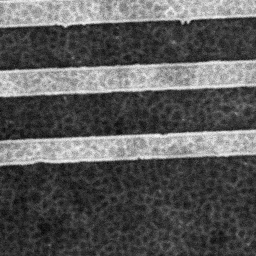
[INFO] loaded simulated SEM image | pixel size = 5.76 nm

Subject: one or a few lines or trenches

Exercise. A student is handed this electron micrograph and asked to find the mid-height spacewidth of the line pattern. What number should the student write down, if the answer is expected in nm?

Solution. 263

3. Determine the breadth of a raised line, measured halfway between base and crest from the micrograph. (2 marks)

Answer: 23.2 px